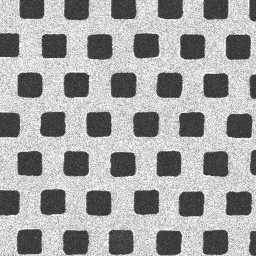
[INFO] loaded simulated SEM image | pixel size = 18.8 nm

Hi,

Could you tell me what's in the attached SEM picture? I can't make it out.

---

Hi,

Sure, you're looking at a regular array of holes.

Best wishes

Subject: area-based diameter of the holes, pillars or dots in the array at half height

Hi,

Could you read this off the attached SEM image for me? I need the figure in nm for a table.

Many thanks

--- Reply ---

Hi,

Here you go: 524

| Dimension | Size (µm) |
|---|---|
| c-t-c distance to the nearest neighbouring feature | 0.844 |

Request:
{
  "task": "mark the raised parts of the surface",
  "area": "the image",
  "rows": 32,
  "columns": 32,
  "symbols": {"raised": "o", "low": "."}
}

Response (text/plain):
oo....oo...ooo...ooo...oo....oo.
oo....oo...ooo...ooo...oo....oo.
ooooooooo.oooooooooooooooooooooo
oooooooooooooooooooooooooooooooo
..ooo...ooo...ooo...ooo..oooo..o
..ooo...ooo...ooo...oo....oo...o
..ooo...ooo...ooo...oo....oo...o
ooooooooooooooooooooooo.ooooo.oo
oooooooooooooooooooooooooooooooo
oo...ooo...ooo...ooo...ooo..oooo
oo...ooo...ooo...ooo...oo....oo.
oo...ooo...ooo...ooo...oo...ooo.
oooooooooooooooooooooooooooooooo
oooooooooooooooooooooooooooooooo
..ooo...ooo...ooo...ooo..oooo..o
...oo...ooo...ooo...oo....oo....
..ooo...ooo...ooo...oo...ooo....
oooooooooooooooooooooooooooooooo
oooooooooooooooooooooooooooooooo
oo...ooo...ooo...ooo...ooo..ooo.
oo...ooo...ooo...oo....oo....oo.
oo...ooo...ooo...ooo...oo....oo.
oooooooooooooooooooooooooooooooo
oooooooooooooooooooooooooooooooo
..ooo...ooo...ooo...oo....oo...o
...oo...ooo...ooo...oo....oo...o
..ooo...ooo...ooo...oo...ooo...o
oooooooooooooooooooooooooooooooo
oooooooooooooooooooooooooooooooo
oo...ooo...oo....ooo...oo...ooo.
oo...ooo...oo....oo....oo....oo.
oo...ooo...ooo...ooo..oooo..ooo.